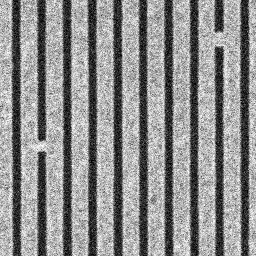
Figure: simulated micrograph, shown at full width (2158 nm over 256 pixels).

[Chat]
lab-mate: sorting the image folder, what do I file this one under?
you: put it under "parallel lines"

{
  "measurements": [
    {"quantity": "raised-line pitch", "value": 0.213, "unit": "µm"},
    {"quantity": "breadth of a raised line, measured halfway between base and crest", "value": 126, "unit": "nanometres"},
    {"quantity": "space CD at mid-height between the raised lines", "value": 82.2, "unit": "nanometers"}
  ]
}